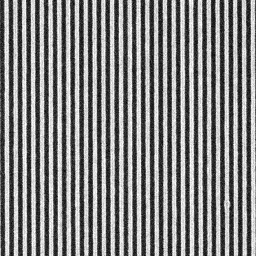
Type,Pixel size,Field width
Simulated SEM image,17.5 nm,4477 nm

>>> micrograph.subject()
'parallel lines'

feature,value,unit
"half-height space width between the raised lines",91.8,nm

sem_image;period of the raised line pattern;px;8.8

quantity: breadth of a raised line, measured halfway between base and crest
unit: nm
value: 61.2